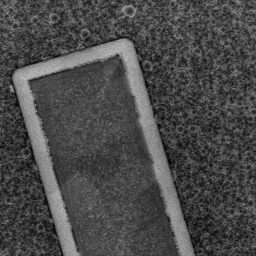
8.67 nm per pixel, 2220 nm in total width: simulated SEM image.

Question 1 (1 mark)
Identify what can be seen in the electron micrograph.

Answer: one or a few lines or trenches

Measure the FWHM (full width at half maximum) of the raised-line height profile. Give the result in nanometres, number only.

934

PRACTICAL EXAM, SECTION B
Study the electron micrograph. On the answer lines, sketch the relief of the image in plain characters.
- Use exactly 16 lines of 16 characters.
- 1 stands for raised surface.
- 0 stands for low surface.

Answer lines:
0000000000000000
0000000000000000
0000000000000000
0000001100000000
0011111100000000
0011111110000000
0011111110000000
0011111110000000
0011111110000000
0001111111000000
0001111111000000
0001111111000000
0000111111100000
0000111111100000
0000111111100000
0000111111100000